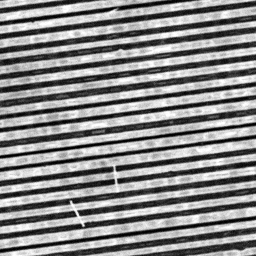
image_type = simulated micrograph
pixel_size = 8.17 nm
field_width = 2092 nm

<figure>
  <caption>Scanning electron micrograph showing parallel lines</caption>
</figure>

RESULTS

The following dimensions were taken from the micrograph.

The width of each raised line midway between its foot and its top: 55.7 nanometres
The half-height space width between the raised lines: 54.7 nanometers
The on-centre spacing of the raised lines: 108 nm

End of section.